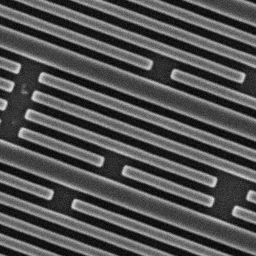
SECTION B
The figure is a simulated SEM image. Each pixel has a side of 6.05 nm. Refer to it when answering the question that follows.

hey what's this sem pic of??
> groups of lines, slits or small figures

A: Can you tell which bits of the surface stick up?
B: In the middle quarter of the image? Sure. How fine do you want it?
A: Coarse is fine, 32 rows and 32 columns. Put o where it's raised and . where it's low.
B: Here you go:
oooooooooooo......oooo..........
ooooooooooooooo.............o...
..ooooooooooooooo..........oooo.
.....ooooooooooooooo.......ooooo
o.......oooooooooooooo.......ooo
oooo.......ooooooooooooooo......
oooooo.......ooooooooooooooo....
...ooooooo......ooooooooooooooo.
.....ooooooo.......ooooooooooooo
........ooooooo.......oooooooooo
ooo.......oooooooo......oooooooo
oooooo.......ooooooo.......ooooo
..ooooooo.......ooooooo.......oo
....ooooooo.......ooooooo.......
.......ooooooo.......oooooooo...
ooo.......ooooooo.......ooooooo.
ooooo........ooooooo.......ooooo
.ooooooo.......ooooooo.......ooo
....ooooooo.......ooooooo.......
......oooooooo.......ooooooo....
oo........ooooooo.......ooooooo.
ooooo.......ooooooo.......oooooo
.ooooooo.......ooooooo.......ooo
...ooooooo.......ooooooo.......o
......oooo..........ooooooo.....
oo.....................ooooooo..
oooo...........ooo........oooooo
ooooooo........oooooo.......oooo
oooooooooo.......ooooooo.......o
ooooooooooooo.......ooooooo.....
.oooooooooooooo.......ooooooo...
....oooooooooooooo.......ooooooo